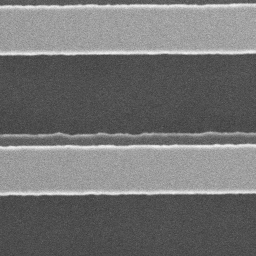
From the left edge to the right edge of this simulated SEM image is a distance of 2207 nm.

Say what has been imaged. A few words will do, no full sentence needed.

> lines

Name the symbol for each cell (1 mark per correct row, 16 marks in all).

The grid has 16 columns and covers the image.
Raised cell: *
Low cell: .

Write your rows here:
****************
****************
****************
................
................
................
................
................
****************
****************
****************
****************
................
................
................
................